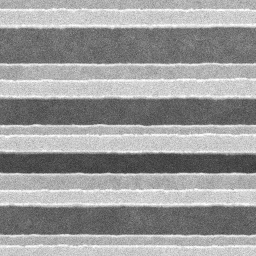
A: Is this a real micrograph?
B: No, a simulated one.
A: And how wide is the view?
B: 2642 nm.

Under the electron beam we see lines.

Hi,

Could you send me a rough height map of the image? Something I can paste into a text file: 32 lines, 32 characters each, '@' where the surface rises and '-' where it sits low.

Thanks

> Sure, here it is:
@@@@@@@@@@@@@@@@@@@@@@@@@@@@@@@@
@@@@@@@@@@@@@@@@@@@@@@@@@@@@@@@@
@@@@@@@@@@@@@@@@@@@@@@@@@@@@@@@@
--------------------------------
--------------------------------
--------------------------------
--------------------------------
--------------------------------
@@@@@@@@@@@@@@@@@@@@@@@@@@@@@@@@
@@@@@@@@@@@@@@@@@@@@@@@@@@@@@@@@
@@@@@@@@@@@@@@@@@@@@@@@@@@@@@@@@
@@@@@@@@@@@@@@@@@@@@@@@@@@@@@@@@
--------------------------------
--------------------------------
--------------------------------
--------------------------------
@@@@@@@@@@@@@@@@@@@@@@@@@@@@@@@@
@@@@@@@@@@@@@@@@@@@@@@@@@@@@@@@@
@@@@@@@@@@@@@@@@@@@@@@@@@@@@@@@@
--------------------------------
--------------------------------
--------------------------------
@@@@@@@@@@@@@@@@@@@@@@@@@@@@@@@@
@@@@@@@@@@@@@@@@@@@@@@@@@@@@@@@@
@@@@@@@@@@@@@@@@@@@@@@@@@@@@@@@@
@@@@@@@@@-@@@@@@@@@@@@@@@@@@@@@@
--------------------------------
--------------------------------
--------------------------------
@@@@@@@@@@@@@@@@@@@@@@@@@-@@@@@@
@@@@@@@@@@@@@@@@@@@@@@@@@@@@@@@@
@@@@@@@@@@@@@@@@@@@@@@@@@@@@@@@@